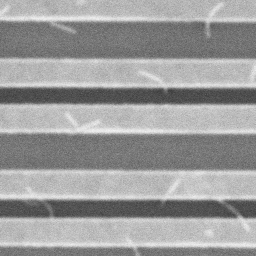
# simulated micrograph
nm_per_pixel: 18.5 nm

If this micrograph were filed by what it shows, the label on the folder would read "lines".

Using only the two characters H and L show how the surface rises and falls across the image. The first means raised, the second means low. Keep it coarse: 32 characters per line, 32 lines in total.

HHHHHHHHHHHHHHHHHHHHHHHHHHHHHHHH
HHHHHHHHHHHHHHHHHHHHHHHHHHHHHHHH
LLLLLLLLLLLLLLLLLLLLLLHLLHHHHHHH
LLLLLLLLLLLLLLLLLLLLLLLLLLLLLLLL
LLLLLLLLLLLLLLLLLLLLLLLLLLLLLLLL
LLLLLLLLLLLLLLLLLLLLLLLLLLLLLLLL
LLLLLLLLLLLLLLLLLLLLLLLLLLLLLLLL
HHLHHHLLLLLLLLLLLLLLLLLLLLLLLLLL
HHHHHHHHHHHHHHHHHHHHHHHHHHHHHHHH
HHHHHHHHHHHHHHHHHHHHHHHHHHHHHHHH
HHHHHHHHHHHHHHHHHHHHHHHHHHHHHHHH
LLLLLLLLLLLLLLLLLLLLLLLLLLLLLLLL
LLLLLLLLLLLLLLLLLLLLLLLLLLLLLLLL
HHHHHHHHHHHHHHHHHHHHHHHHHHHHHHHH
HHHHHHHHHHHHHHHHHHHHHHHHHHHHHHHH
HHHHHHHHHHHHHHHHHHHHHHHHHHHHHHHH
LLLLLLLLHHHHHHHHHHHHHHHHHHHHHHHH
LLLLLLLLLLLLLLLLLLLLLLLLLLLLLLLL
LLLLLLLLLLLLLLLLLLLLLLLLLLLLLLLL
LLLLLLLLLLLLLLLLLLLLLLLLLLLLLLLL
LLLLLLLLLLLLLLLLLLLLLLLLLLLLLLLL
HHHHHHHHHHHHHHLLLLLLLLLLLLLLLLLL
HHHHHHHHHHHHHHHHHHHHHHHHHHHHHHHH
HHHHHHHHHHHHHHHHHHHHHHHHHHHHHHHH
HHHHHHHHHHHHHHHHHHHHHHHHHHHHHHHH
LLLLLLLLLLLLLLLLLLLLLLLLLLLLLLLL
LLLLLLLLLLLLLLLLLLLLLLLLLLLLLLLL
HHHHHHHHHHHHHHHHHHHHHHHHHHHHHHHH
HHHHHHHHHHHHHHHHHHHHHHHHHHHHHHHH
HHHHHHHHHHHHHHHHHHHHHHHHHHHHHHHH
HHHHHHHHHHHHHHHHHHHHHHHHHHHHHHHH
LLLLLLLLLLLLLLLLLLLLLLLLLLLLLLLL